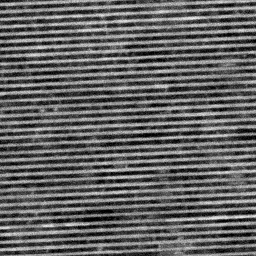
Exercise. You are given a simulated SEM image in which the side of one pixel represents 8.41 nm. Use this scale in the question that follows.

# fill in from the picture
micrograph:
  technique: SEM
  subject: parallel lines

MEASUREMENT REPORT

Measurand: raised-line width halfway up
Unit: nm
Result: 19.9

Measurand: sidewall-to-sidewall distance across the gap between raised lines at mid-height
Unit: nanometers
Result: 40.9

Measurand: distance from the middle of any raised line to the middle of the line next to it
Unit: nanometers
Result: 62.4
